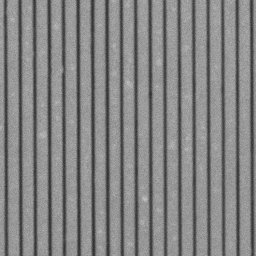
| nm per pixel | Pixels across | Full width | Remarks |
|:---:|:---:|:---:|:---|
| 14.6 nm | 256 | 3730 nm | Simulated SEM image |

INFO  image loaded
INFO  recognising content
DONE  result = parallel lines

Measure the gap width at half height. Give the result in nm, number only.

52.8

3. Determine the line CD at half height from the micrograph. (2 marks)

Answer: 158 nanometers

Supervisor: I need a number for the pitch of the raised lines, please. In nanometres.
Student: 211